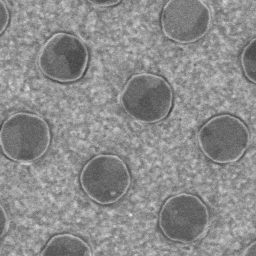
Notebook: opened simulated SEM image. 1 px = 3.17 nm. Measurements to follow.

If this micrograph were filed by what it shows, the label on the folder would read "raised bodies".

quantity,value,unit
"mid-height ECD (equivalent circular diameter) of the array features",152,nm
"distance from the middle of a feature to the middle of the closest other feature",279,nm